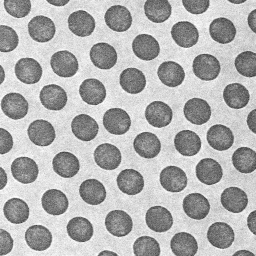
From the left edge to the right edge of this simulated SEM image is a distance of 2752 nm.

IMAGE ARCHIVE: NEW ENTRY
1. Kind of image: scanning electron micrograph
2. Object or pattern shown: a regular array of holes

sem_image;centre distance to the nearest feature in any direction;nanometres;386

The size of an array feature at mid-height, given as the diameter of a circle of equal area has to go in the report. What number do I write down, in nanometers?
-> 294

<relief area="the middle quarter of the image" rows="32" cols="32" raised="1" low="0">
00001111000011111111111100000111
00011111111111100001111000000011
00011111111111000000111000000011
11111111111111000000111100000011
11111000011111000000111100000011
11110000001111000000111111000111
11110000001111100000111111111111
01110000000111111011111111111111
01110000001111111111111111111111
01111000001111111111110001111110
11111111111111111111100000111100
11111111111000011111000000011100
11110111110000001111000000011100
11100001110000000111000000011100
11000000110000000111100000011110
11000000010000000111110000111111
11000000010000001111111111111101
11000000111100011110000111110000
11100000111111111100000011100000
11111111111111111000000011100000
11111111000001111000000011110000
11111111000000111100000011110000
00111110000000111100000011111000
00011110000000111111001111111111
00001111000000111111111111111111
00001111100000111111111111001111
00001111110011100011111100000011
00011111111111000001111100000011
00111111111110000000111100000001
11111000011110000000111100000001
11110000001110000000111100000001
11110000001111000000111110000011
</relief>